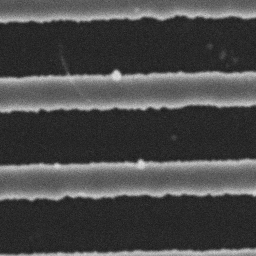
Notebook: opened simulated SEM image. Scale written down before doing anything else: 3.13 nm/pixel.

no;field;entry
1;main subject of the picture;lines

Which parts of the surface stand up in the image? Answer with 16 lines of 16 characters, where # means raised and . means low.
################
................
................
................
................
################
################
................
................
................
################
################
................
................
................
................